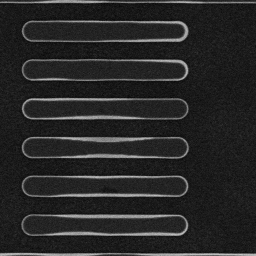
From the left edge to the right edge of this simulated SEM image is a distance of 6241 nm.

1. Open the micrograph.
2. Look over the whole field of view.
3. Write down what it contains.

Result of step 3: groups of lines, slits or small figures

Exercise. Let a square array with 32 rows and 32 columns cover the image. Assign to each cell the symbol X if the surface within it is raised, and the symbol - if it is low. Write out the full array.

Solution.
--------------------------------
--------------------------------
--------------------------------
---XXXXXXXXXXXXXXXXXXXX---------
---XXXXXXXXXXXXXXXXXXXX---------
--------------------------------
--------------------------------
--------------------------------
---XXXXXXXXXXXXXXXXXXXX---------
---XXXXXXXXXXXXXXXXXXXX---------
--------------------------------
--------------------------------
----XXXXXXXXXXXXXXXXXXX---------
---XXXXXXXXXXXXXXXXXXXX---------
---XXXXXXXXXXXXXXXXXXXX---------
--------------------------------
--------------------------------
---XXXXXXXXXXXXXXXXXXXX---------
---XXXXXXXXXXXXXXXXXXXX---------
---XXXXXXXX-----XXXXXXX---------
--------------------------------
--------------------------------
---XXXXXXXXXXXXXXXXXXXX---------
---XXXXXXXXXXXXXXXXXXXX---------
----XXXX------------XXX---------
--------------------------------
--------------------------------
---XXXXXXXXXXXXXXXXXXXX---------
---XXXXXXXXXXXXXXXXXXXX---------
--------------------------------
--------------------------------
--------------------------------